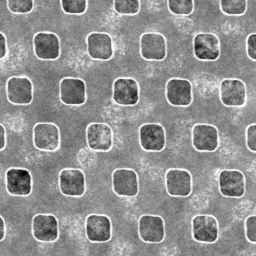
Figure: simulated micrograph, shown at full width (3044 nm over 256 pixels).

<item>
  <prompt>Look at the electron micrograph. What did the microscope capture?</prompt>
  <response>a regular array of holes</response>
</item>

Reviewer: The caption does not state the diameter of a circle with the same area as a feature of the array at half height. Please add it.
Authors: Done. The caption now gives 326 nm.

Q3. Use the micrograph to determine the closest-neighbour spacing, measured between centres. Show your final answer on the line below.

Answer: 624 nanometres